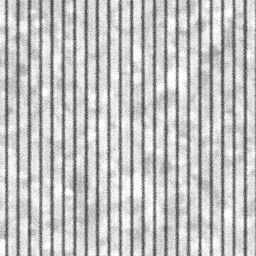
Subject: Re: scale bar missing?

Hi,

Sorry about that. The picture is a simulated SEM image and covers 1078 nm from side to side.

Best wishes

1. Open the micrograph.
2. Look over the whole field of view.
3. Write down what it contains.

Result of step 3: parallel lines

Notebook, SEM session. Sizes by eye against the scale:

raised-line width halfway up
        30.5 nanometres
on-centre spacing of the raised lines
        47.8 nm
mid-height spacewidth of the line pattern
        15.8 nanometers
